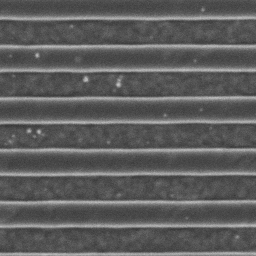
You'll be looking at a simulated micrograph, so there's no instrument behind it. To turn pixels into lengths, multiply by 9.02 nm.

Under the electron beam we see wiring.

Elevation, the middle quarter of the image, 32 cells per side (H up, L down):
HHHHHHHHHHHHHHHHHHHHHHHHHHHHHHHH
HHHHHHHHHHHHHHHHHHHHHHHHHHHHHHHH
LLLLLLLLLLLLLLLLLLLLLLLLLLLLLLLL
LLLLLLLLLLLLLLLLLLLLLLLLLLLLLLLL
LLLLLLLLLLLLLLLLLLLLLLLLLLLLLLLL
LLLLLLLLLLLLLLLLLLLLLLLLLLLLLLLL
LLLLLLLLLLLLLLLLLLLLLLLLLLLLLLLL
LLLLLLLLLLLLLLLLLLLLLLLLLLLLLLLL
HHHHHHHHHHHHHHHHHHHHHHHHHHHHHHHH
HHHHHHHHHHHHHHHHHHHHHHHHHHHHHHHH
HHHHHHHHHHHHHHHHHHHHHHHHHHHHHHHH
HHHHHHHHHHHHHHHHHHHHHHHHHHHHHHHH
HHHHHHHHHHHHHHHHHHHHHHHHHHHHHHHH
HHHHHHHHHHHHHHHHHHHHHHHHHHHHHHHH
HHHHHHHHHHHHHHHHHHHHHHHHHHHHHHHH
LLLLLLLLLLLLLLLLLLLLLLLLLLLLLLLL
LLLLLLLLLLLLLLLLLLLLLLLLLLLLLLLL
LLLLLLLLLLLLLLLLLLLLLLLLLLLLLLLL
LLLLLLLLLLLLLLLLLLLLLLLLLLLLLLLL
LLLLLLLLLLLLLLLLLLLLLLLLLLLLLLLL
LLLLLLLLLLLLLLLLLLLLLLLLLLLLLLLL
HHHHHHHHHHHHHHHHHHHHHHHHHHHHHHHH
HHHHHHHHHHHHHHHHHHHHHHHHHHHHHHHH
HHHHHHHHHHHHHHHHHHHHHHHHHHHHHHHH
HHHHHHHHHHHHHHHHHHHHHHHHHHHHHHHH
HHHHHHHHHHHHHHHHHHHHHHHHHHHHHHHH
HHHHHHHHHHHHHHHHHHHHHHHHHHHHHHHH
HHHHHHHHHHHHHHHHHHHHHHHHHHHHHHHH
LLLLLLLLLLLLLLLLLLLLLLLLLLLLLLLL
LLLLLLLLLLLLLLLLLLLLLLLLLLLLLLLL
LLLLLLLLLLLLLLLLLLLLLLLLLLLLLLLL
LLLLLLLLLLLLLLLLLLLLLLLLLLLLLLLL